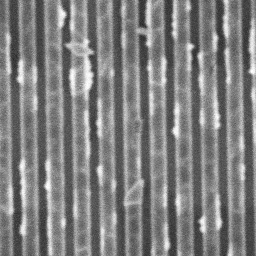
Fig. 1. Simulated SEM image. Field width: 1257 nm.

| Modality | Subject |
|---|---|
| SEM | parallel lines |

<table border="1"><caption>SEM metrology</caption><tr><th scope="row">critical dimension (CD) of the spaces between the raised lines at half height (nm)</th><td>50.9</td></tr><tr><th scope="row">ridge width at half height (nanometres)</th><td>76.7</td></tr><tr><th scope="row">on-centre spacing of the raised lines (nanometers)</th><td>127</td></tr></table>